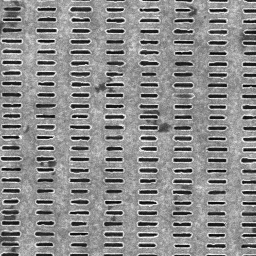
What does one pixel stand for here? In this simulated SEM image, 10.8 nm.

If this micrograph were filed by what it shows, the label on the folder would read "a regular array of holes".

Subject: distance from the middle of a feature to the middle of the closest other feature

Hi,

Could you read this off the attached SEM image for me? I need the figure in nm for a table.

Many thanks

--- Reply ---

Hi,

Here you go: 114